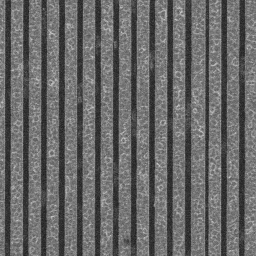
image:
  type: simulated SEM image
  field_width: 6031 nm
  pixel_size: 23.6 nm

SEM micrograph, parallel lines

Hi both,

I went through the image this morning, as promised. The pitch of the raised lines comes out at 424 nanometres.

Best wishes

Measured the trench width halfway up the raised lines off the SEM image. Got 153 nm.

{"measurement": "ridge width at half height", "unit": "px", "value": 11.9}